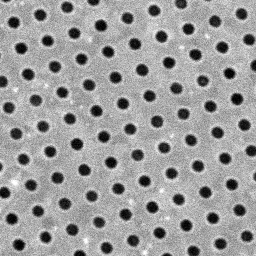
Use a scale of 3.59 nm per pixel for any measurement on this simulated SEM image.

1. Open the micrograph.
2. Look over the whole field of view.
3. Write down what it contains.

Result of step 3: a regular array of holes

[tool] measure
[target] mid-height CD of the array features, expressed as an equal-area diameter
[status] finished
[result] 46.9 nanometres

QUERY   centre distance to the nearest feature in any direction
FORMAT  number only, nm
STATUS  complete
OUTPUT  96.2